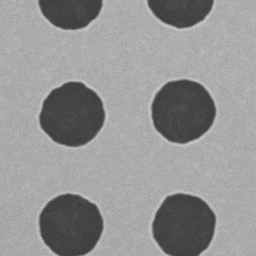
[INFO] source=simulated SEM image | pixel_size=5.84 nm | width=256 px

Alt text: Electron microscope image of holes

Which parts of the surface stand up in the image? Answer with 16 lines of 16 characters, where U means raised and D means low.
UUUDDDUUUDDDDUUU
UUUDDDUUUUDDUUUU
UUUUUUUUUUUUUUUU
UUUUUUUUUUUUUUUU
UUUUUUUUUUUUUUUU
UUUUDDUUUUDDDUUU
UUUDDDUUUUDDDUUU
UUDDDDDUUUDDDUUU
UUUDDDUUUUDDDUUU
UUUUUUUUUUUUUUUU
UUUUUUUUUUUUUUUU
UUUUUUUUUUUUUUUU
UUUDDUUUUUDDDUUU
UUUDDDUUUUDDDUUU
UUUDDDUUUUDDDUUU
UUUDDDUUUUDDDUUU